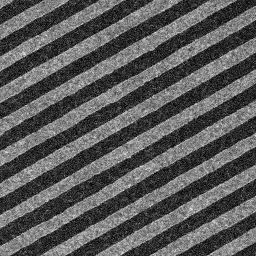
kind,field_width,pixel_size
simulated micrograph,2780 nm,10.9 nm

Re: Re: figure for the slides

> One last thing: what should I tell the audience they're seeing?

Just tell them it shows parallel lines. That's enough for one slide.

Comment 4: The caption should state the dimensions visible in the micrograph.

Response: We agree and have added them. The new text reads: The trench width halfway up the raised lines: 166 nm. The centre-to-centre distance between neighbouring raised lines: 298 nm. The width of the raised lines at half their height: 131 nm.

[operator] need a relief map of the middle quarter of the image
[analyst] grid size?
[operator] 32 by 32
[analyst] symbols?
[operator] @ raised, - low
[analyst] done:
--------@@@@@@@-------@@@@@@----
------@@@@@@@-------@@@@@@------
----@@@@@@@--------@@@@@--------
---@-@@@@--------@@@@@--------@@
-@@@@@@--------@@@@@---------@@@
@@@@@--------@@@@@@--------@@@@@
@@@--------@@@@@@@-------@@@@@@-
@@--------@@@@@@-------@@@@@@---
--------@@@@@@--------@@@@@@----
------@@@@@@@-------@@@@@@------
----@@@@@@--------@@@@@@--------
--@@@@@@--------@@@@@@@-------@@
-@@@@@@--------@@@@@@--------@@@
@@@@@--------@@@@@@--------@@@@@
@@@@-------@@@@@@--------@@@@@@-
@@-------@@@@@@--------@@@@@@---
--------@@@@@@-------@@@@@@@----
------@@@@@@--------@@@@@@------
----@@@@@@--------@@@@@@--------
--@@@@@@--------@@@@@@@-------@@
@@@@@@@-------@@@@@@@-------@@@@
@@@@@--------@@@@@@-------@@@@@@
@@@--------@@@@@@--------@@@@@@-
@--------@@@@@@@-------@@@@@@---
--------@@@@@@-------@@@@@@-----
------@@@@@@-------@@@@@@-------
----@@@@@@-------@@@@@@@--------
--@@@@@@--------@@@@@@--------@@
-@@@@@--------@@@@@@--------@@@@
@@@@---------@@@@@@-------@@@@@@
@@---------@@@@@@--------@@@@@--
@--------@@@@@@--------@@@@@@---